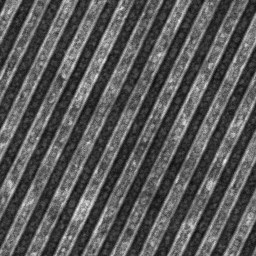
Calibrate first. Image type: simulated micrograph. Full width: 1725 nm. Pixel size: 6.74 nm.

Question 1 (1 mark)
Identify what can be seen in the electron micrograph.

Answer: parallel lines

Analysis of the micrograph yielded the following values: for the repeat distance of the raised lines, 172 nanometers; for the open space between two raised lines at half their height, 0.0934 um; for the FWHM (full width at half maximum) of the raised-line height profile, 80.5 nm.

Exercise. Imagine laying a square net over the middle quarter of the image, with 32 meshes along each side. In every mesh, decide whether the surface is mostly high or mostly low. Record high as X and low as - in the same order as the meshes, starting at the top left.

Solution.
XXX---XXX----XXXX----XXX---XXXX-
XX----XXX----XXX----XXX----XXX--
XX---XXX----XXXX----XXX----XXX--
X----XXX----XXX----XXX----XXX---
X---XXXX---XXXX----XXX----XXX---
----XXX----XXX----XXX----XXXX---
---XXXX---XXXX----XXX----XXX----
---XXX----XXX----XXX----XXXX---X
--XXXX----XXX----XXX----XXX----X
--XXX----XXX----XXX----XXXX---XX
-XXXX----XXX----XXX----XXX----XX
-XXX----XXX----XXX----XXXX---XXX
XXXX----XXX----XXX----XXX----XXX
XXX----XXX----XXXX---XXXX---XXXX
XXX----XXX----XXX----XXX----XXX-
XX----XXX----XXXX---XXXX---XXXX-
XX----XXX----XXX----XXX----XXX--
X----XXX----XXXX---XXXX---XXXX--
X----XXX----XXX----XXX----XXX---
----XXX----XXXX---XXXX---XXXX---
----XXX----XXX----XXX----XXX----
---XXX----XXXX---XXXX----XXX----
---XXX----XXX----XXX----XXX----X
--XXXX---XXXX---XXXX----XXX----X
--XXX----XXX----XXX----XXXX---XX
-XXXX----XXX---XXXX----XXX----XX
-XXX----XXX----XXX----XXX----XXX
XXXX----XXX---XXXX----XXX----XXX
XXX----XXX----XXX----XXX----XXX-
XXX----XXX---XXXX----XXX----XXX-
XX----XXX----XXX----XXXX---XXXX-
XX----XXX----XXX----XXX----XXX--